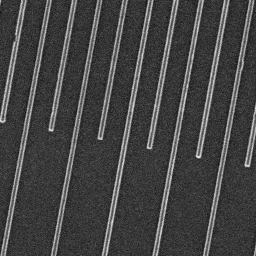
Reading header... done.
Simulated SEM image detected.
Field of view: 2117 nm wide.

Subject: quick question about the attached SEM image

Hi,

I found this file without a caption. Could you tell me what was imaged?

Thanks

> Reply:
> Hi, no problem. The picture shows parallel lines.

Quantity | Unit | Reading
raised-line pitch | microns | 0.206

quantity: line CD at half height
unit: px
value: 3.94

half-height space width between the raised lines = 170 nm